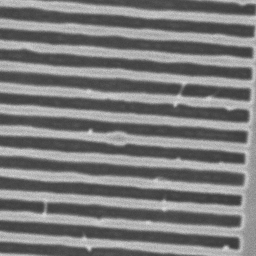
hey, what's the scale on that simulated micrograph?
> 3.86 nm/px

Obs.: parallel lines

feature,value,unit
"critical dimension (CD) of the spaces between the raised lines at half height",43.8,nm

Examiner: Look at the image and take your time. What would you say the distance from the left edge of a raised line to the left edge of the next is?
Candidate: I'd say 81.9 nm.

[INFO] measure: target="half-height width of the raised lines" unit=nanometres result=36.5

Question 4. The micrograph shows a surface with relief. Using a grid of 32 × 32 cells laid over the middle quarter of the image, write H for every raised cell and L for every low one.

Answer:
LLLLLLLLLLLLLLLLLLLLLLLLLLLLLLLL
HHHHHHHHHHHHHHHHLLLLLLLLLLLLLLLL
HHHHHHHHHHHHHHHHHHHHHHHHHHLLLLLL
LLLLLLLLLLHHHLHHHHHHHHHHHHHHHHHH
LLLLLLLLLLLLLLLLLLLLLLLLHHHHHHHH
LLLLLLLLLLLLLLLLLLLLLLLLLLLLLLLL
HHHHHHHLLLLLLLLLLLLLLLLLLLLLLLLL
HHHHHHHHHHHHHHHHHHHHHLLHLLLLLLLL
LLLLLHHHHHHHHHHHHHHHHHHHHHHHHHHH
LLLLLLLLLLLLLLLLLLHHHHHHHHHHHHHH
LLLLLLLLLLLLLLLLLLLLLLLLLLLLLLLL
HHHHLLLLLLLLLLLLLLLLLLLLLLLLLLLL
HHHHHHHHHHHHHHHHHHLLLLLLLLLLLLLL
LLHHHHHHHHHHHHHHHHHHHHHHHHHHLLLL
LLLLLLLLLLLLHHHHHHHHHHHHHHHHHHHH
LLLLLLLLLLLLLLLLLLLLLLLLLLLHHHHH
LLLLLLLLLLLLLLLLLLLLLLLLLLLLLLLL
HHHHHHHHHHHHHHHHLLLLLLLLLLLLLLLL
HHHHHHHHHHHHHHHHHHHHHHHHHHHHHLLL
LLLLLLLLLLHHHHHHHHHHHHHHHHHHHHHH
LLLLLLLLLLLLLLLLLLLLLLLHHHHHHHHH
LLLLLLLLLLLLLLLLLLLLLLLLLLLLLLLL
HHHHHHHHHLLLLLLLLLLLLLLLLLLLLLLL
HHHHHHHHHHHHHHHHHHHHHHHLLLLLHLLL
LHHLHHHHHHHHHHHHHHHHHHHHHHHHHHHH
LLLLLLLLLLLLLLLLLLHHHHHHHHHHHHHH
LLLLLLLLLLLLLLLLLLLLLLLLLLLLLLLL
HHHHHLLLLLLLLLLLLLLLLLLLLLLLLLLL
HHHHHHHHHHHHHHHHHHHHLLLHLLLLLLLL
LLLLLHHHHHHHHHHHHHHHHHHHHHHHHHLL
LLLLLLLLLLLLLLLHHHHHHHHHHHHHHHHH
LLLLLLLLLLLLLLLLLLLLLLLLLLLLHHHH